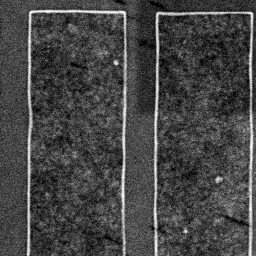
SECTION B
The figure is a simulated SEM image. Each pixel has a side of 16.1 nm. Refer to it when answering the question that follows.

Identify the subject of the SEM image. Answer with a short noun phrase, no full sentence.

wiring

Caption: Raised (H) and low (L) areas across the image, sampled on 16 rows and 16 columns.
LLLLLLLLLLLLLLLL
LLHHHHHHLLHHHHHH
LLHHHHHHLLHHHHHH
LLHHHHHHLLHHHHHH
LLHHHHHHLLHHHHHH
LLHHHHHHLLHHHHHH
LLHHHHHHLLHHHHHH
LLHHHHHHLLHHHHHH
LLHHHHHHLLHHHHHH
LLHHHHHHLLHHHHHH
LLHHHHHHLLHHHHHH
LLHHHHHHLLHHHHHH
LLHHHHHHLLHHHHHH
LLHHHHHHLLHHHHHH
LLHHHHHHLLHHHHHH
LLHHHHHHLLHHHHHH